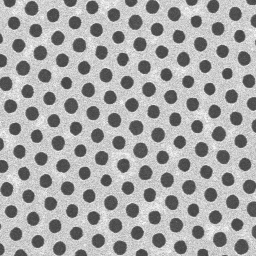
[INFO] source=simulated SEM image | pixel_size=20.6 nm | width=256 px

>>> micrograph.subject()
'a regular array of holes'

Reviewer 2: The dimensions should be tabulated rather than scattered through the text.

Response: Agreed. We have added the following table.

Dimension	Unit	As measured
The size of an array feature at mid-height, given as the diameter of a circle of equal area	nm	275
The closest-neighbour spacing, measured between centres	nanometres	467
